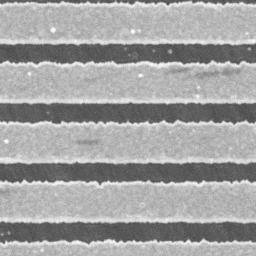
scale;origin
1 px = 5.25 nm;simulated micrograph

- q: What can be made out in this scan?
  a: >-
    lines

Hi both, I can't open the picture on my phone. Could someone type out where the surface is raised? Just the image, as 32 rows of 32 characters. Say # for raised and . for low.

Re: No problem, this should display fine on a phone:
################.##########.###.
################################
################################
################################
################################
.#....#..#..##....##.....#.###..
................................
................................
################################
################################
################################
################################
################################
................................
................................
################################
################################
################################
################################
################################
................................
................................
................................
################################
################################
################################
################################
################################
................................
................................
################################
################################